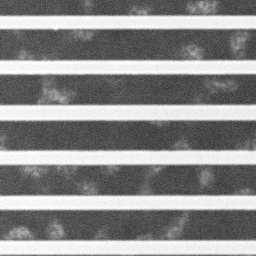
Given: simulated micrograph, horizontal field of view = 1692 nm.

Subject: parallel lines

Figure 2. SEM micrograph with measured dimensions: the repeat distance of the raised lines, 0.298 micrometres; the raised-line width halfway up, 82.6 nm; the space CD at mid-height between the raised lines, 218 nanometers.